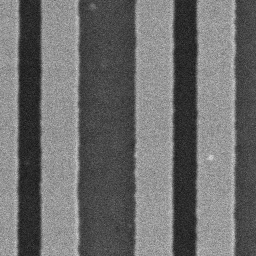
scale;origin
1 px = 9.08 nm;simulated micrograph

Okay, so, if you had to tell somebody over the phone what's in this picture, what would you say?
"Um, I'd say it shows lines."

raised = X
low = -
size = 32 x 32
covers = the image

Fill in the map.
XX---XXXXX-------XXXXX---XXXX---
XX---XXXXX-------XXXXX---XXXX---
XX---XXXXX-------XXXXX---XXXX---
XX---XXXXX-------XXXXX---XXXX---
XX---XXXXX-------XXXXX---XXXX---
XX---XXXXX-------XXXXX---XXXX---
XX---XXXXX-------XXXXX---XXXX---
XX---XXXXX-------XXXXX---XXXX---
XX---XXXXX-------XXXXX---XXXX---
XX---XXXXX-------XXXXX---XXXX---
XX---XXXXX-------XXXXX---XXXX---
XX---XXXXX-------XXXXX---XXXX---
XX---XXXXX-------XXXXX---XXXX---
XX---XXXXX-------XXXXX---XXXX---
XX---XXXXX-------XXXXX---XXXX---
XX---XXXXX-------XXXXX---XXXX---
XX---XXXXX-------XXXXX---XXXX---
XX---XXXXX-------XXXXX---XXXX---
XX---XXXXX-------XXXXX---XXXX---
XX---XXXXX-------XXXXX---XXXX---
XX---XXXXX-------XXXXX---XXXX---
XX---XXXXX-------XXXXX---XXXX---
XX---XXXXX-------XXXXX---XXXX---
XX---XXXXX-------XXXXX---XXXX---
XX---XXXXX-------XXXXX---XXXX---
XX---XXXXX-------XXXXX---XXXX---
XX---XXXXX-------XXXXX---XXXX---
XX---XXXXX-------XXXXX---XXXX---
XX---XXXXX-------XXXXX---XXXX---
XX---XXXXX-------XXXXX---XXXX---
XX---XXXXX-------XXXXX---XXXX---
XX---XXXXX-------XXXXX---XXXX---